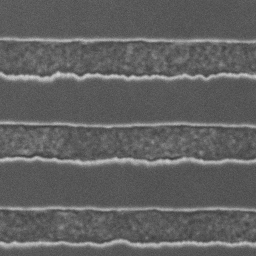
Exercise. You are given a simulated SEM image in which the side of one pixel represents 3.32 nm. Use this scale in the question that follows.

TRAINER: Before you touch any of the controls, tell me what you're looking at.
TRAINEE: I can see lines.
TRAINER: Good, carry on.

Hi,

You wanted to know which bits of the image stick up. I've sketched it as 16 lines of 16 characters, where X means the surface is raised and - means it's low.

XXXXXXXXXXXXXXXX
XXXXXXXXXXXXXXXX
-XXXXXXXXXXXXXXX
----------------
----------------
XXXXXXXXXXXXXXXX
XXXXXXXXXXXXXXXX
XXXXXXXXXXXXXXXX
----------------
----------------
XXXXXXXXXXXXXXXX
XXXXXXXXXXXXXXXX
XXXXXXXXXXXXXXXX
----------------
----------------
XXXXXXXXXXXXXXXX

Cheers